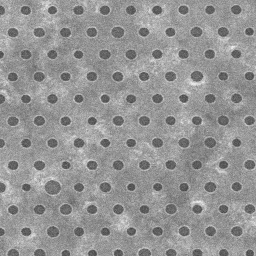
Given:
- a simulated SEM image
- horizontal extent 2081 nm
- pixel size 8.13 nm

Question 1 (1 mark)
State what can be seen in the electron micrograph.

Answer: a regular array of holes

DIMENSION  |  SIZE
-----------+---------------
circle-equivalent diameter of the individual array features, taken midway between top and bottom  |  0.0836 microns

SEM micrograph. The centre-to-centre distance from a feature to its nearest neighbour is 0.208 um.